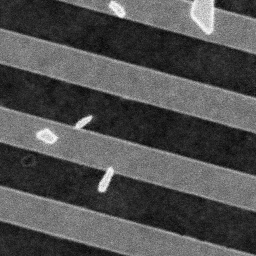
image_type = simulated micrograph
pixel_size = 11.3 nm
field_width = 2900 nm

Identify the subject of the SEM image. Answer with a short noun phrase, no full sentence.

one or a few lines or trenches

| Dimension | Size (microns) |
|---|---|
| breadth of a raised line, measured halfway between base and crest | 0.366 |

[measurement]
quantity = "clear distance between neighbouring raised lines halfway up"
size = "0.489 microns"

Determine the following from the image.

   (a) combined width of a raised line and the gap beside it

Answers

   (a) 860 nanometres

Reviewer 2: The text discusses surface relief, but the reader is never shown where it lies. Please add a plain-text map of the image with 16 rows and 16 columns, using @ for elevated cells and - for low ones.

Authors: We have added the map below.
-----@@@@@@@@@--
---------@@@@@@@
@@@----------@@@
@@@@@@----------
--@@@@@@@@------
------@@@@@@@@--
---------@@@@@@@
@@@----------@@@
@@@@@@@---------
--@@@@@@@@------
------@@@@@@@@--
----------@@@@@@
@@@----------@@@
@@@@@@@---------
---@@@@@@@------
------@@@@@@@@--